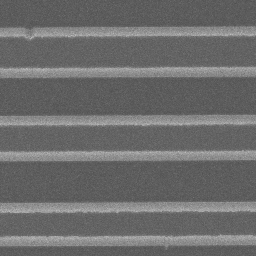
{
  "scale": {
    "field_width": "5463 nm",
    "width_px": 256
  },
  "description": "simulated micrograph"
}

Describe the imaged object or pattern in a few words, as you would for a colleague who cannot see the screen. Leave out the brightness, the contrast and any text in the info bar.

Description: one or a few lines or trenches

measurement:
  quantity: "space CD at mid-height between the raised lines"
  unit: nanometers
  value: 1020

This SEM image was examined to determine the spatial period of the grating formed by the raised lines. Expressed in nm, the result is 1830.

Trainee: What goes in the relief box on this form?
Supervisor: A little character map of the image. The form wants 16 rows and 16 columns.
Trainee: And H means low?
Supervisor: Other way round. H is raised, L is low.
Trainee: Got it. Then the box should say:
LLLLLLLLLLLLLLLL
LLLLLLLLLLLLLLLL
HHHHHHHHHHHHHHHH
HHHHHHHHHHHHHHHH
HHHHHHHHHHHHHHHH
LLLLLLLLLLLLLLLL
LLLLLLLLLLLLLLLL
LLLLLLLLLLLHHHHH
HHHHHHHHHHHHHHHH
HHHHHHHHHHHHHHHH
LLLLLLLLLLLLLLLL
LLLLLLLLLLLLLLLL
LLLLLLLLLLLLLLLL
HHHHHHHHHHHHHHHH
HHHHHHHHHHHHHHHH
LLLLLLLLLLLLLLLL